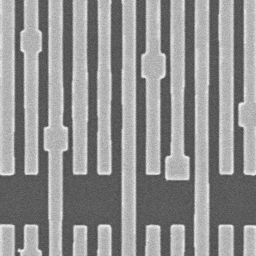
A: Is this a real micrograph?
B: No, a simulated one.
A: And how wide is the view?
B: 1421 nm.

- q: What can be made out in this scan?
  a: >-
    wiring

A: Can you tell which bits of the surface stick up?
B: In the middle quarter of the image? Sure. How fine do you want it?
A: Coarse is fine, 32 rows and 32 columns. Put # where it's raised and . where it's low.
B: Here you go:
..####...##....###..#####..###..
..####...##....###..#####..###..
..####...##....###..#####..###..
..####...##....###..####...###..
..####...##....###...###...###..
..####...##....###...###...###..
..####...##....###...###...###..
..####...##....###...###...###..
..####...##....###...###...###..
..####...##....###...###...###..
..####...##....###...###...###..
..####...##....###...###...###..
..####...##....###...###...###..
..####...##....###...###...###..
..####...##....###...###...###..
..####...##....###...###...###..
#.####...##....###...###...###..
#.####...##....###...###...###..
#.####...##....###...###...###..
#.####...##....###...###...###..
#.####...##....###...###...###..
..####...##....###...###...###..
..####...##....###...###...###..
..####...###...###...###..#####.
..####...##....###...###..#####.
..####...##....###...###..#####.
..####...##....###...###..#####.
...............###........#####.
...............###........#####.
...............###..............
...............###..............
...............###..............